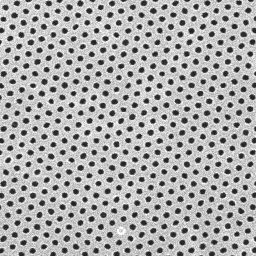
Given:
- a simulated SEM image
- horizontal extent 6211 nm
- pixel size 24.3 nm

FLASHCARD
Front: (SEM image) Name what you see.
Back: a regular array of holes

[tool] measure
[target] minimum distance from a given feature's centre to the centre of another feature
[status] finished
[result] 11.7 pixels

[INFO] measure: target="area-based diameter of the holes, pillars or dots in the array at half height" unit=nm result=157